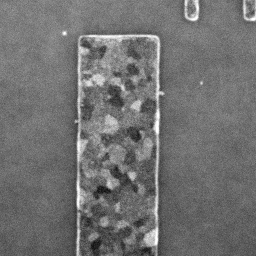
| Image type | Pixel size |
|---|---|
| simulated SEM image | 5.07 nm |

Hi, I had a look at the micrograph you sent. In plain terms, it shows wiring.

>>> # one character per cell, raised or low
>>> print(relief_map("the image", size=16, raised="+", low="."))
...............+
................
.....+++++......
.....+++++......
.....+++++......
.....+++++......
.....+++++......
.....+++++......
.....+++++......
.....+++++......
.....+++++......
.....+++++......
.....+++++......
.....+++++......
.....+++++......
.....+++++......